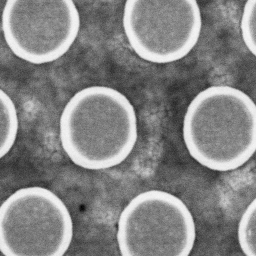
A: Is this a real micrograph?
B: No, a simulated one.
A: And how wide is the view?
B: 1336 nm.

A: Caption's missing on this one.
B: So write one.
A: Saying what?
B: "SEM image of raised bodies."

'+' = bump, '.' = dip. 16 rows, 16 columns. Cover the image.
.++++...++++...+
+++++...++++...+
.+++....++++....
..+......++.....
................
................
+....+++....++++
+...++++....++++
+...++++....++++
.....+++....++++
................
................
.+++.....++.....
++++....++++...+
++++....++++...+
++++....++++...+